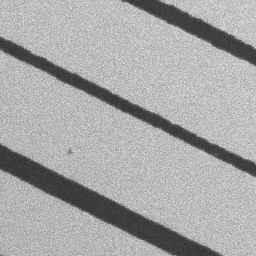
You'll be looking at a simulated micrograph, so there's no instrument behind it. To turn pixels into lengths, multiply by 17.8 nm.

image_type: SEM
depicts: one or a few lines or trenches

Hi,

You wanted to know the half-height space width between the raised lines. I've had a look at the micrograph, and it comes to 1.47 um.